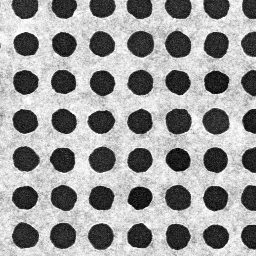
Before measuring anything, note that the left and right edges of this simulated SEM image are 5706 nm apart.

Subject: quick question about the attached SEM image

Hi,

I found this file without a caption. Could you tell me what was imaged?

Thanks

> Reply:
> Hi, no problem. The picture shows a regular array of holes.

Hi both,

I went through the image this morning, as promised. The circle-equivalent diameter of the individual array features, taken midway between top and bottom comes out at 564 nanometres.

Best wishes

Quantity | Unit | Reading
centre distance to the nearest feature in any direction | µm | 0.839